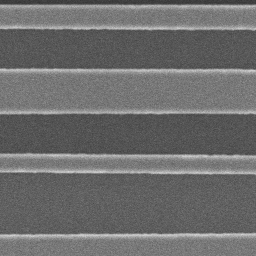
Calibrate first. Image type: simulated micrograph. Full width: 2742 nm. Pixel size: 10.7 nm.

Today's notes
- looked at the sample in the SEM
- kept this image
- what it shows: lines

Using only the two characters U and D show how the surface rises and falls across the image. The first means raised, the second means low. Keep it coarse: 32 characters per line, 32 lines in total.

DDDDDDDDDDDDDDDDDDDDDDDDDDDDDDDD
UUUUUUUUUUUUUUUUUUUUUUUUUUUUUUUU
UUUUUUUUUUUUUUUUUUUUUUUUUUUUUUUU
UUUUUUUUUUUUUUUUUUUUUUUUUUUUUUUU
DDDDDDDDDDDDDDDDDDDDDDDDDDDDDDDD
DDDDDDDDDDDDDDDDDDDDDDDDDDDDDDDD
DDDDDDDDDDDDDDDDDDDDDDDDDDDDDDDD
DDDDDDDDDDDDDDDDDDDDDDDDDDDDDDDD
DDDDDDDDDDDDDDDDDDDDDDDDDDDDDDDD
UUUUUUUUUUUUUUUUUUUUUUUUUUUUUUUU
UUUUUUUUUUUUUUUUUUUUUUUUUUUUUUUU
UUUUUUUUUUUUUUUUUUUUUUUUUUUUUUUU
UUUUUUUUUUUUUUUUUUUUUUUUUUUUUUUU
UUUUUUUUUUUUUUUUUUUUUUUUUUUUUUUU
DDDDDDDDDDDDDDDDDDDDDDDDDDDDDDDD
DDDDDDDDDDDDDDDDDDDDDDDDDDDDDDDD
DDDDDDDDDDDDDDDDDDDDDDDDDDDDDDDD
DDDDDDDDDDDDDDDDDDDDDDDDDDDDDDDD
DDDDDDDDDDDDDDDDDDDDDDDDDDDDDDDD
UUUUUUUUUUUUUUUUUUUUUUUUUUUUUUUD
UUUUUUUUUUUUUUUUUUUUUUUUUUUUUUUU
DDDDDDDUUUUUUUUUUUUUUUUUUUUUUUUU
DDDDDDDDDDDDDDDDDDDDDDDDDDDDDDDD
DDDDDDDDDDDDDDDDDDDDDDDDDDDDDDDD
DDDDDDDDDDDDDDDDDDDDDDDDDDDDDDDD
DDDDDDDDDDDDDDDDDDDDDDDDDDDDDDDD
DDDDDDDDDDDDDDDDDDDDDDDDDDDDDDDD
DDDDDDDDDDDDDDDDDDDDDDDDDDDDDDDD
DDDDDDDDDDDDDDDDDDDDDDDDDDDDDDDD
UUUUUUUUUUUUUUUUUUUUUUUUUUUUUUUU
UUUUUUUUUUUUUUUUUUUUUUUUUUUUUUUU
UUUUUUUUUUUUUUUUUUUUUUUUUUUUUUUU